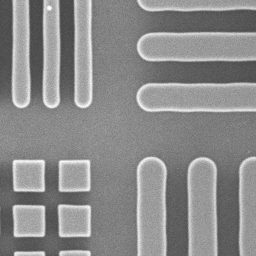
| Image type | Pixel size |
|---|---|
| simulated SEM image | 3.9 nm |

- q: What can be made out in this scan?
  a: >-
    groups of lines, slits or small figures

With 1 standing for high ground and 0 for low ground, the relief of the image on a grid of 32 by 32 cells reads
00110110011000000111111111111111
00110110011000000000000000000000
00110110011000000000000000000000
00110110011000000000000000000000
00110110011000000011111111111111
00110110011000000111111111111111
00110110011000000111111111111111
00110110011000000001111111111110
00110110011000000000000000000000
00110110011000000000000000000000
00110110011000000000111000001111
00110110011000000111111111111111
00110110011000000111111111111111
00000000000000000011111111111111
00000000000000000000000000000000
00000000000000000000000000000000
00000000000000000000000000000000
00000000000000000000000000000000
00000000000000000000000000000000
00000000000000000000000000000000
00111001111000000111000011100011
00111001111000000111100011100011
00111001111000000111100011100011
00111001111000000111100011100011
00000000000000000111100011100011
00000000000000000111100011100011
00111101111000000111100011100011
00111101111000000111100011100011
00111101111000000111100011100011
00111000110000000111100011100011
00000000000000000111100011100011
00000000111000000111100011100011